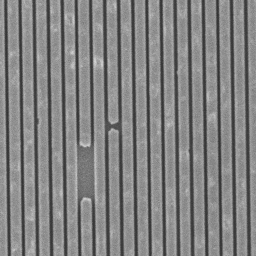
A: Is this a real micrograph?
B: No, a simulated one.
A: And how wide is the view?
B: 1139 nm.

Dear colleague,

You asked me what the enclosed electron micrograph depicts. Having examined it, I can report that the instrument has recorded parallel lines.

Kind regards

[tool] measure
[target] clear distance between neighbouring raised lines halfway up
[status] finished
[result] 16.1 nm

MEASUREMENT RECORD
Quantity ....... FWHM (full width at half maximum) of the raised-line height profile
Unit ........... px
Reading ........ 11.1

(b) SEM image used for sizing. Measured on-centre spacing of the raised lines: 62.7 nm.